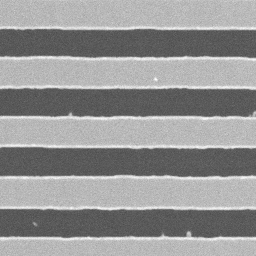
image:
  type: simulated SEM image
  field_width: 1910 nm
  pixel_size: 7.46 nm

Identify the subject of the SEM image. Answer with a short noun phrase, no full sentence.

lines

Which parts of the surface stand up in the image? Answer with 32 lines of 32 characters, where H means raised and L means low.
HHHHHHHHHHHHHHHHHHHHHHHHHHHHHHHH
HHHHHHHHHHHHHHHHHHHHHHHHHHHHHHHH
HHHHHHHHHHHHHHHHHHHHHHHHHHHHHHHH
HHHHHHHHHHHHHHHHHHHHHHHHHHHHHHHH
LLLLLLLLLLLLLLLLLLLLLLLLLLLLLLLL
LLLLLLLLLLLLLLLLLLLLLLLLLLLLLLLL
LLLLLLLLLLLLLLLLLLLLLLLLLLLLLLLL
HHHHHHHHHHHHHHHHHHHHHHHHHHHHHHHH
HHHHHHHHHHHHHHHHHHHHHHHHHHHHHHHH
HHHHHHHHHHHHHHHHHHHHHHHHHHHHHHHH
HHHHHHHHHHHHHHHHHHHHHHHHHHHHHHHH
LLLLLLLLLLLLLLLLLLLLLLLLLLLLLLLL
LLLLLLLLLLLLLLLLLLLLLLLLLLLLLLLL
LLLLLLLLLLLLLLLLLLLLLLLLLLLLLLLL
LLLLLLLLLLLLLLLLLLLLLLLLLLLLLLLL
HHHHHHHHHHHHHHHHHHHHHHHHHHHHHHHH
HHHHHHHHHHHHHHHHHHHHHHHHHHHHHHHH
HHHHHHHHHHHHHHHHHHHHHHHHHHHHHHHH
LLLLLLLLLLLLLLLLHHHLLLLLHHLLHHLL
LLLLLLLLLLLLLLLLLLLLLLLLLLLLLLLL
LLLLLLLLLLLLLLLLLLLLLLLLLLLLLLLL
LLLLLLLLLLLLLLLLLLLLLLLLLLLLLLLL
HHHHHHHHHHHHHHHHHHHHHHHHHHHHHHHH
HHHHHHHHHHHHHHHHHHHHHHHHHHHHHHHH
HHHHHHHHHHHHHHHHHHHHHHHHHHHHHHHH
HHHHHHHHHHHHHHHHHHHHHHHHHHHHHHHH
LLLLLLLLLLLLLLLLLLLLLLLLLLLLLLLL
LLLLLLLLLLLLLLLLLLLLLLLLLLLLLLLL
LLLLLLLLLLLLLLLLLLLLLLLLLLLLLLLL
LLLLLLLLLLLLLLLLLLLLLLLLLLLLLLLL
HHHHHHHHHHHHHHHHHHHHHHHHHHHHHHHH
HHHHHHHHHHHHHHHHHHHHHHHHHHHHHHHH